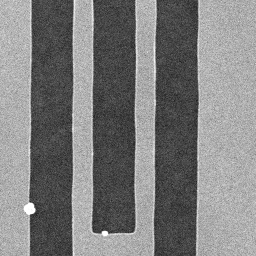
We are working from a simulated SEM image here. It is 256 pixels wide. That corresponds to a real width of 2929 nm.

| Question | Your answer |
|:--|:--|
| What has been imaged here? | groups of lines, slits or small figures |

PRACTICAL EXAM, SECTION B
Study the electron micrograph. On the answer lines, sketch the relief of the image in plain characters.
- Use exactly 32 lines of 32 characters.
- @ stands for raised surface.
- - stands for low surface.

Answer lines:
@@@@-----@@@-----@@------@@@@@@@
@@@@-----@@@-----@@------@@@@@@@
@@@@-----@@@-----@@------@@@@@@@
@@@@-----@@@-----@@------@@@@@@@
@@@@-----@@@-----@@------@@@@@@@
@@@@-----@@@-----@@------@@@@@@@
@@@@-----@@@-----@@------@@@@@@@
@@@@-----@@@-----@@------@@@@@@@
@@@@-----@@@-----@@------@@@@@@@
@@@@-----@@@-----@@------@@@@@@@
@@@@-----@@@-----@@------@@@@@@@
@@@@-----@@------@@------@@@@@@@
@@@@-----@@------@@------@@@@@@@
@@@@-----@@------@@------@@@@@@@
@@@@-----@@------@@------@@@@@@@
@@@@-----@@------@@------@@@@@@@
@@@@-----@@------@@------@@@@@@@
@@@@-----@@------@@------@@@@@@@
@@@@-----@@@-----@@------@@@@@@@
@@@@-----@@@-----@@------@@@@@@@
@@@@-----@@@-----@@------@@@@@@@
@@@@-----@@------@@------@@@@@@@
@@@@-----@@------@@------@@@@@@@
@@@@-----@@@-----@@------@@@@@@@
@@@@-----@@@-----@@------@@@@@@@
@@@@-----@@------@@------@@@@@@@
@@@@-----@@------@@------@@@@@@@
@@@@-----@@------@@------@@@@@@@
@@@@-----@@------@@------@@@@@@@
@@@@-----@@@@@@@@@@------@@@@@@@
@@@@-----@@@@@@@@@@------@@@@@@@
@@@@-----@@@@@@@@@@------@@@@@@@